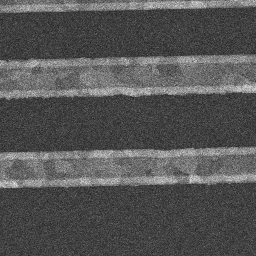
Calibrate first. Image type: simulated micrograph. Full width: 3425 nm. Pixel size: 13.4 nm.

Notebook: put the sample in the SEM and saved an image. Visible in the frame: one or a few lines or trenches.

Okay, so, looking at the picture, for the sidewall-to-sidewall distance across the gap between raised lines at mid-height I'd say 794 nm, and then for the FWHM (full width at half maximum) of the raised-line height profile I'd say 28.2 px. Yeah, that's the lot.